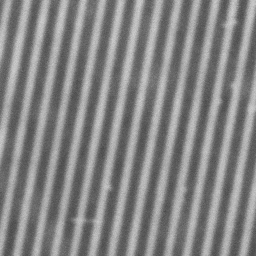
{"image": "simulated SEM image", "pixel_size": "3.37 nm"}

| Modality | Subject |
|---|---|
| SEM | parallel lines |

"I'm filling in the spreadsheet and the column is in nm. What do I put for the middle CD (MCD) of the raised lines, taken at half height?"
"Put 21.5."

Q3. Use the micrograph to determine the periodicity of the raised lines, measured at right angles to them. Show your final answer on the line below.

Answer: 18.5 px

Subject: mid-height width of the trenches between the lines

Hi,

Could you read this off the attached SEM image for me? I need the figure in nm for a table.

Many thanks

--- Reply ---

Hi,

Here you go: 39.7